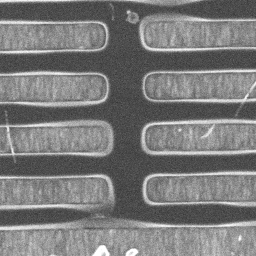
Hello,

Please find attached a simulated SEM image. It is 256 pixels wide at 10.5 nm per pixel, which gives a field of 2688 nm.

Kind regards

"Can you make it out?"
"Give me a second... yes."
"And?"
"groups of lines, slits or small figures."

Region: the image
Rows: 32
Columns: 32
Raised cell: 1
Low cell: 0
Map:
11111111111111111111111111111111
11111111111111111111111111111111
11111111111111111110000011111111
00000000000001111100000000000000
00000000000001111100000000000000
00000000000001111100000000000000
01111111111111111111111111111111
11111111111111111111111111111111
11111111111111111111111111111111
00000000000001111100000000000000
00000000000001111100000000000000
00000000000001111100000000000000
00000000000001111110000000000011
11111111111111111111111111111111
11111111111111111111111111111111
11111111110011111111000000000000
00000000000000111100000000000000
00000000000000111100000000000000
00000000000000111100000000000000
11111111111111111111111111111111
11111111111111111111111111111111
11111111111111111111111111111111
00000000000001111100000000000000
00000000000000111100000000000000
00000000000000111100000000000000
00000000000001111111111111111111
11111111111111111111111111111111
11111111111111111111111111111111
11100000000000000000000000000000
00000000000000000000000000000000
00000000000000000000000000000000
00000000000010001000000000000000